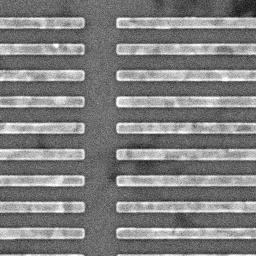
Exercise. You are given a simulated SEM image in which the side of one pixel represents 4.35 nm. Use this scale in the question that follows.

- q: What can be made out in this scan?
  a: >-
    groups of lines, slits or small figures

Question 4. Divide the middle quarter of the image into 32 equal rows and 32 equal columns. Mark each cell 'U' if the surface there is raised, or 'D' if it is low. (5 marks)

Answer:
DDDDDDDDDDDDDDDDDDDDDDDDDDDDDDDD
DDDDDDDDDDDDDDDDDDDDDDDDDDDDDDDD
UUUUUDDDDDDDDUUUUUUUUUUUUUUUUUUU
UUUUUDDDDDDDDUUUUUUUUUUUUUUUUUUU
DDDDDDDDDDDDDDDDDDDDDDDDDDDDDDDD
DDDDDDDDDDDDDDDDDDDDDDDDDDDDDDDD
DDDDDDDDDDDDDDDDDDDDDDDDDDDDDDDD
DDDDDDDDDDDDDDDDDDDDDDDDDDDDDDDD
UUUUUDDDDDDDDDDUUUUUUUUUUUUUUUUU
UUUUUDDDDDDDDUUUUUUUUUUUUUUUUUUU
UUUUUDDDDDDDDDUUUUUUUUUUUUUUUUUU
DDDDDDDDDDDDDDDDDDDDDDDDDDDDDDDD
DDDDDDDDDDDDDDDDDDDDDDDDDDDDDDDD
DDDDDDDDDDDDDDDDDDDDDDDDDDDDDDDD
DDDDDDDDDDDDDDDDDDDDDDDDDDDDDDDD
UUUUUDDDDDDDDUUUUUUUUUUUUUUUUUUU
UUUUUDDDDDDDDUUUUUUUUUUUUUUUUUUU
DDDDDDDDDDDDDDDDDDDDDDDDDDDDDDDD
DDDDDDDDDDDDDDDDDDDDDDDDDDDDDDDD
DDDDDDDDDDDDDDDDDDDDDDDDDDDDDDDD
DDDDDDDDDDDDDDDDDDDDDDDDDDDDDDDD
UUUUDDDDDDDDDDUUUUUUUDDDDUUUDDDU
UUUUUDDDDDDDDUUUUUUUUUUUUUUUUUUU
UUUUUDDDDDDDDUUUUUUUUUUUUUUUUUUU
DDDDDDDDDDDDDDDDDDDDDDDDDDDDDDDD
DDDDDDDDDDDDDDDDDDDDDDDDDDDDDDDD
DDDDDDDDDDDDDDDDDDDDDDDDDDDDDDDD
DDDDDDDDDDDDDDDDDDDDDDDDDDDDDDDD
UUUUUDDDDDDDDUUUUUUUUUUUUUUUUUUU
UUUUUDDDDDDDDUUUUUUUUUUUUUUUUUUU
DDDDDDDDDDDDDDDDDDDDDDDDDDDDDDDD
DDDDDDDDDDDDDDDDDDDDDDDDDDDDDDDD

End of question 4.